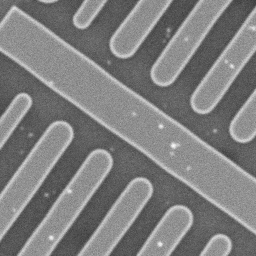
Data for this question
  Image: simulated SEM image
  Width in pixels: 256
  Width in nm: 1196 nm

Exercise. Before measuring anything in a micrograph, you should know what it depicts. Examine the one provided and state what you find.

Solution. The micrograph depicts groups of lines, slits or small figures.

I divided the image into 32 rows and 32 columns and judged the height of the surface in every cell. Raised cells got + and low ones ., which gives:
..........+++....++++....++++...
.++.......++....++++....++++....
++++.....+++....++++...++++....+
++++++....+....++++....+++....++
+++++++.......++++....++++...+++
++++++++......++++...++++....+++
++++++++++....+++...++++....++++
..+++++++++.........++++...++++.
...++++++++++......++++...++++..
....++++++++++.....+++....++++..
......+++++++++.....+....++++...
.......++++++++++.......++++....
..++.....+++++++++......+++....+
.+++......++++++++++....+++...++
+++........++++++++++.........++
++.....+.....+++++++++.......+++
+.....+++.....++++++++++.....+++
+....++++.......+++++++++.....+.
....++++.........++++++++++.....
....++++...+++....++++++++++....
...++++...++++......+++++++++...
..++++....++++.......++++++++++.
.++++....++++....+.....+++++++++
.++++...++++....+++.....++++++++
++++....+++....++++......+++++++
+++....++++...++++.........+++++
+++...++++....+++....+++....++++
++...++++....++++...++++......++
+....++++...++++...+++++.......+
....++++....+++....++++....+....
...++++....++++...++++....+++...
...+++....++++...++++....++++...